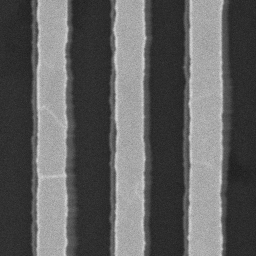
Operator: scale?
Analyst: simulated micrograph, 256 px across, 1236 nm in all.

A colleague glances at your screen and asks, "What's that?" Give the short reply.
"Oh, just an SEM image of lines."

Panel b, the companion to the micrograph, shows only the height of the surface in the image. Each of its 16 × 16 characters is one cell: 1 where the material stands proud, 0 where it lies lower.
0011000110001100
0011000110001100
0011000110001100
0011000110001100
0011000110001100
0011000110001100
0011000110001100
0011000110001100
0011000110001100
0011000110001100
0011000110001100
0011000110001100
0011000110001100
0011000110001100
0011000110001100
0011000110001100